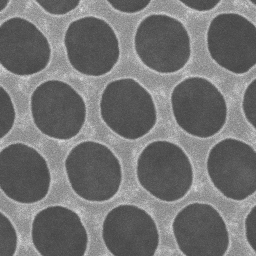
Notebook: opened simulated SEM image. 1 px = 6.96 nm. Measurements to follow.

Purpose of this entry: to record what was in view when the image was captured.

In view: holes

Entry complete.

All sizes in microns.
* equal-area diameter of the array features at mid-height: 0.401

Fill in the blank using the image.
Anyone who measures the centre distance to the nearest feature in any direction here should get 492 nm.